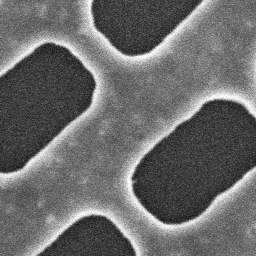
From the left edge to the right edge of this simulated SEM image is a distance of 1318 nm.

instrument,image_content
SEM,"holes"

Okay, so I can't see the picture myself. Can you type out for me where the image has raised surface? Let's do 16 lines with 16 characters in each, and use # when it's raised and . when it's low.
######......####
######.....#####
#######...######
##...###.#######
......##########
......##########
......#######..#
.....#######....
....######......
...######.......
.#######........
########.......#
#########.....##
#####.####..####
####....########
###.....########